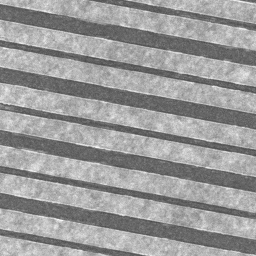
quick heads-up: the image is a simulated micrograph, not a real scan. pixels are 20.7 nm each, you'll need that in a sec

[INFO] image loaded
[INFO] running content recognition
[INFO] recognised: parallel lines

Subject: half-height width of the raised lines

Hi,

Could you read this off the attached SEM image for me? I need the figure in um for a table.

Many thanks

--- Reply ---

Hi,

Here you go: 0.402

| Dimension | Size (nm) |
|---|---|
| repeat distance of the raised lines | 642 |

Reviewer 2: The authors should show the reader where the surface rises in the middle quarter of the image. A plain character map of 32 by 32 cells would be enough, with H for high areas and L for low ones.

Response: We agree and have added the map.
HHHHHHHHHLLLLLLLLLLLHHHHHHHHHHHH
HHHHHHHHHHHHHHHLLLLLLLLLLHHHHHHH
HHHHHHHHHHHHHHHHHHHHHLLLLLLLLLLH
HHHHHHHHHHHHHHHHHHHHHHHHHHLLLLLL
LLLLLHHHHHHHHHHHHHHHHHHHHHHHHHHL
LLLLLLLLLLHHHHHHHHHHHHHHHHHHHHHH
LLLLLLLLLLLLLLLLHHHHHHHHHHHHHHHH
LLLLLLLLLLLLLLLLLLLLLHHHHHHHHHHH
HHHHLLLLLLLLLLLLLLLLLLLLLLLHHHHH
HHHHHHHHHHLLLLLLLLLLLLLLLLHLLLLL
HHHHHHHHHHHHHHHLLLLLLLLLLLHLLLLL
HHHHHHHHHHHHHHHHHHHHHLLLLLLLLLLL
HHHHHHHHHHHHHHHHHHHHHHHHHHLLLLLL
LLLLLHHHHHHHHHHHHHHHHHHHHHHHHHHL
LLLLLLLLLLLHHHHHHHHHHHHHHHHHHHHH
HHHHHHLLLLLLLLLLHHHHHHHHHHHHHHHH
HHHHHHHHHHHLLLLLLLLLLLHHHHHHHHHH
HHHHHHHHHHHHHHHHLLLLLLLLLLLHHHHH
HHHHHHHHHHHHHHHHHHHHHHLLLLLLLLLL
LHHHHHHHHHHHHHHHHHHHHHHHHHHLLLLL
LLLLLLLHHHHHHHHHHHHHHHHHHHHHHHHH
LLLLLLLLLLLLHHHHHHHHHHHHHHHHHHHH
LLLLLLLLLLLLLLLLLHHHHHHHHHHHHHHH
LLLLLLLLLLLLLLLLLLLLLLLHHHHHHHHH
HHHHHHLLLLLLLLLLHHLLLLLLHLLLHHHH
HHHHHHHHHHHLLLLLLLLLLLLLHHLLLLLL
HHHHHHHHHHHHHHHHHLLLLLLHHHLLLLLL
HHHHHHHHHHHHHHHHHHHHHHLLLLLLLLLL
LHHHHHHHHHHHHHHHHHHHHHHHHHHHLLLL
LLLLLLLHHHHHHHHHHHHHHHHHHHHHHHHH
HHLLLLLLLLLLHHHHHHHHHHHHHHHHHHHH
HHHHHHHLLLLLLLLLLLHHHHHHHHHHHHHH